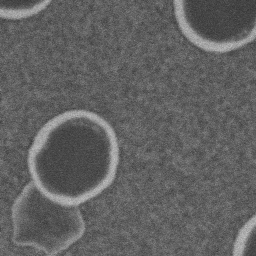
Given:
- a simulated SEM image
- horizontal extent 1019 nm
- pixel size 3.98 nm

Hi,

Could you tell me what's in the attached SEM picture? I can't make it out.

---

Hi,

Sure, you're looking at raised bodies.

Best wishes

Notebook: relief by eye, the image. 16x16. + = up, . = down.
++.........+++++
...........+++++
............+++.
................
................
................
................
....++..........
...++++.........
..+++++.........
..+++++.........
..+++++.........
....+...........
................
...............+
...............+